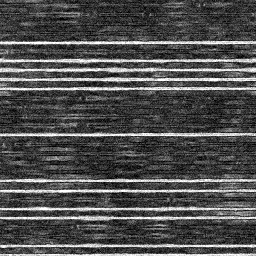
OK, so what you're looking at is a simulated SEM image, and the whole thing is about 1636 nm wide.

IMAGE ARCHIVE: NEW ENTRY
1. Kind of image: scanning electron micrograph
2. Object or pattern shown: parallel lines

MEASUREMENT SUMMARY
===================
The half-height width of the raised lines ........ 0.0128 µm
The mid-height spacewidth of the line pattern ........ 7.12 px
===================